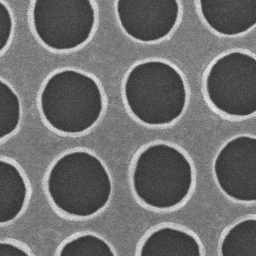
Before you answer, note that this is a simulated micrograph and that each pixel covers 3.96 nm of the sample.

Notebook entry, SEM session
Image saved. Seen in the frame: holes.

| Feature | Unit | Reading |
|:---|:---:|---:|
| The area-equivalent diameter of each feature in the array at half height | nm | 249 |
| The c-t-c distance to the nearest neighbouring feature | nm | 329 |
